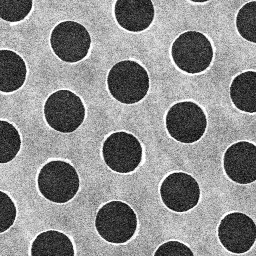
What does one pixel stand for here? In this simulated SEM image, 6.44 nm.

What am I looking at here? a regular array of holes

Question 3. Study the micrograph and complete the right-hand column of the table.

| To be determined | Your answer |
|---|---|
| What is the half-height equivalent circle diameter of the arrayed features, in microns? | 0.271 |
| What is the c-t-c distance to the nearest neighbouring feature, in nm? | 452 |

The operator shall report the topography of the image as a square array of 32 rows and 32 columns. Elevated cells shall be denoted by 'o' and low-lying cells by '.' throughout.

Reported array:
....oooooooooo.....oooooooooooo.
....oooooooooo.....ooooooooooo..
o..oooooooooooo....oooooooooo...
ooooooo....oooo...oooooooooooo..
oooooo.....ooooooooooo....oooo..
oooooo.....ooooooooooo....oooooo
..ooooo....oooooooooo......ooooo
...ooooo..oooooooooooo....oooooo
...ooooooooooo....oooo....oooooo
...oooooooooo......ooooooooooo..
...oooooooooo......oooooooooo...
.oooooo..ooooo....ooooooooooo...
oooooo....ooooo...ooooooooooo...
ooooo......oooooooooo....ooooo..
oooooo.....oooooooooo.....oooooo
.ooooo....ooooooooooo.....oooooo
..oooooo.oooooo.ooooo.....oooooo
...oooooooooo....ooooo...ooooooo
...oooooooooo.....ooooooooooo...
..ooooooooooo.....oooooooooo....
oooooo...oooo....ooooooooooo....
ooooo.....ooooo.oooooooooooo....
ooooo.....ooooooooooo...ooooo...
ooooo.....oooooooooo.....ooooooo
.oooo....ooooooooooo.....ooooooo
..ooooooooooo...ooooo....ooooooo
..oooooooooo.....ooooo.ooooooooo
..oooooooooo.....ooooooooooo....
.ooooooooooo.....oooooooooo.....
ooooo...ooooo....oooooooooo.....
oooo.....ooooooooooo...ooooo....
oooo.....oooooooooo.....ooooo..o